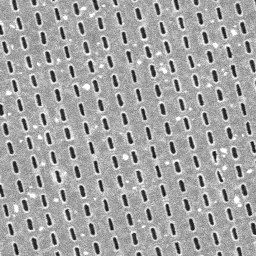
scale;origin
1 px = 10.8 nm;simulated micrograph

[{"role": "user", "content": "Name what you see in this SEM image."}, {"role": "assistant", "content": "a regular array of holes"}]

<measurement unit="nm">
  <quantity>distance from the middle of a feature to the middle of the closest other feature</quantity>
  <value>210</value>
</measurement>